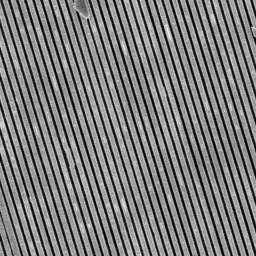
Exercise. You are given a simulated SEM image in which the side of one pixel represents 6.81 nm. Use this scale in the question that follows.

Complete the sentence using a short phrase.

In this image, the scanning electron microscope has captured parallel lines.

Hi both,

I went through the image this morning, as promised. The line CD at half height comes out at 31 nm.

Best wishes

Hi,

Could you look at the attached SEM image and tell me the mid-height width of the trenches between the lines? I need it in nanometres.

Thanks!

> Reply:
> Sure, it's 18.8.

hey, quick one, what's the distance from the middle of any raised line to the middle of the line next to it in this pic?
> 52.6 nm